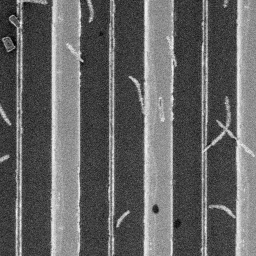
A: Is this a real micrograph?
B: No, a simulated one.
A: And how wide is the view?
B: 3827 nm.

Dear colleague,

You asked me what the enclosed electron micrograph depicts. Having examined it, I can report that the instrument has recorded lines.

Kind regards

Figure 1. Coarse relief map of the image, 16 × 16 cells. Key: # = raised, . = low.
...##....##....#
...##....##....#
...##....##....#
...##....##....#
...##....##....#
...##....##....#
...##....##....#
...##....##....#
...##....##....#
...##....##....#
...##....##....#
...##....##....#
...##....##....#
...##....##....#
...##....##....#
...##....##....#